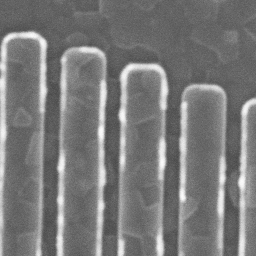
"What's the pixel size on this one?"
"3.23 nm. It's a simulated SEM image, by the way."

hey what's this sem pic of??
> parallel lines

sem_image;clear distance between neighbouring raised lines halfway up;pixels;16.3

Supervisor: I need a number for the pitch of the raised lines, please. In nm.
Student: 195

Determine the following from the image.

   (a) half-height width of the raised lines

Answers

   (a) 0.143 microns